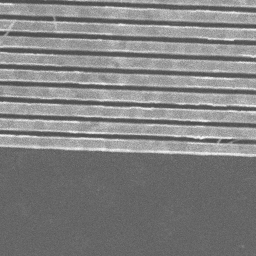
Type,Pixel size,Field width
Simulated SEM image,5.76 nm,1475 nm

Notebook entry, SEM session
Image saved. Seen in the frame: parallel lines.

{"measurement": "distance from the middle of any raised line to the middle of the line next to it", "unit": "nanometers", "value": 95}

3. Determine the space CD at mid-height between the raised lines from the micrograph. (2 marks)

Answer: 29.5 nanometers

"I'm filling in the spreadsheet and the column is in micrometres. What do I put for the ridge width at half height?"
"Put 0.0684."